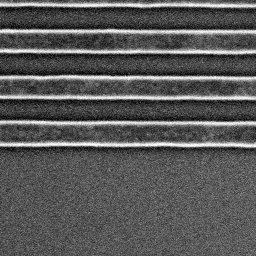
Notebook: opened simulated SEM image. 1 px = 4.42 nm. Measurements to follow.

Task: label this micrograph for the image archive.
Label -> wiring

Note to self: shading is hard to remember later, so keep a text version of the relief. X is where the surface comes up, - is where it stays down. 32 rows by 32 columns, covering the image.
XXXXXXXXXXXXXXXXXXXXXXXXXXXXXXXX
--------------------------------
--------------------------------
--------------------------------
XXXXXXXXXXXXXXXXXXXXXXXXXXXXXXXX
XXXXXXXXXXXXXXXXXXXXXXXXXXXXXXXX
XXX-XXXXXXXXXXXXXXXXXXXXXXXXXXXX
--------------------------------
--------------------------------
--------------------------------
XXXXXXXXXXXXXXXXXXXXXXXXXXXXXXXX
XXXXXXXXXXXXXXXXXXXXXXXXXXXXXXXX
--------------------------------
--------------------------------
--------------------------------
XXXXXXXXXXXXXXXXXXXXXXXXXXXXXXXX
XXXXXXXXXXXXXXXXXXXXXXXXXXXXXXXX
XXXXXXXXXXXXXXXXXXXXXXXXXXXXXXXX
--------------------------------
--------------------------------
--------------------------------
--------------------------------
--------------------------------
--------------------------------
--------------------------------
--------------------------------
--------------------------------
--------------------------------
--------------------------------
--------------------------------
--------------------------------
--------------------------------